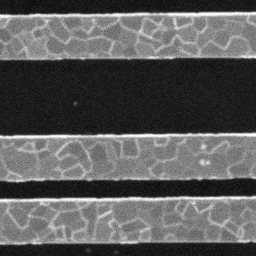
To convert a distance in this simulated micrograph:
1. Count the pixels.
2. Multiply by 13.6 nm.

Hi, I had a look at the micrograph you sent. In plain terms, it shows lines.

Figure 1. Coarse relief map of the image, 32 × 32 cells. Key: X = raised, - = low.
--------------------------------
--------------------------------
XXXXXXXXXXXXXXXXXXXXXXXXXXXXXXXX
XXXXXXXXXXXXXXXXXXXXXXXXXXXXXXXX
XXXXXXXXXXXXXXXXXXXXXXXXXXXXXXXX
XXXXXXXXXXXXXXXXXXXXXXXXXXXXXXXX
XXXXXXXXXXXXXXXXXXXXXXXXXXXXXXXX
--------------------------------
--------------------------------
--------------------------------
--------------------------------
--------------------------------
--------------------------------
--------------------------------
--------------------------------
--------------------------------
--------------------------------
XXXXXXXXXXXXXXXXXXXXXXXXXXXXXXXX
XXXXXXXXXXXXXXXXXXXXXXXXXXXXXXXX
XXXXXXXXXXXXXXXXXXXXXXXXXXXXXXXX
XXXXXXXXXXXXXXXXXXXXXXXXXXXXXXXX
XXXXXXXXXXXXXXXXXXXXXXXXXXXXXXXX
XXXXXX-----X--X-----------------
--------------------------------
--------------------------------
XXXXXXXXXXXXXXXXXXXXXXXXXXXXXXXX
XXXXXXXXXXXXXXXXXXXXXXXXXXXXXXXX
XXXXXXXXXXXXXXXXXXXXXXXXXXXXXXXX
XXXXXXXXXXXXXXXXXXXXXXXXXXXXXXXX
XXXXXXXXXXXXXXXXXXXXXXXXXXXXXXXX
--------------------------------
--------------------------------